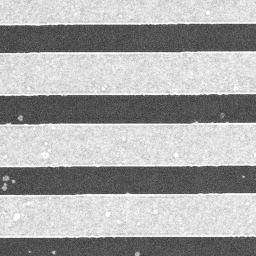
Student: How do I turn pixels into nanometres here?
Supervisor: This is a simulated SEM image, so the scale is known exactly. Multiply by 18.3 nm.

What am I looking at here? lines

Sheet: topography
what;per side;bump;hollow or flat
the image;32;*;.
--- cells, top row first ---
********************************
********************************
********************************
................................
................................
................................
................................
********************************
********************************
********************************
********************************
********************************
................................
................................
................................
.........................*******
********************************
********************************
********************************
********************************
********************************
................................
................................
................................
********************************
********************************
********************************
********************************
********************************
********************************
................................
................................